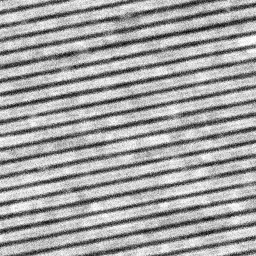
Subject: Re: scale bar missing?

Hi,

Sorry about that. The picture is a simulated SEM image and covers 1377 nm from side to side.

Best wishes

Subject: parallel lines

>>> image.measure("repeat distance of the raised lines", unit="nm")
72.2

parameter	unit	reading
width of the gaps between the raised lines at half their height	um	0.033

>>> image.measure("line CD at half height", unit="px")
6.99